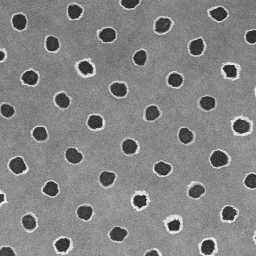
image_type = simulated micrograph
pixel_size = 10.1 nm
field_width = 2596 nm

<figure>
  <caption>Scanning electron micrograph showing a regular array of holes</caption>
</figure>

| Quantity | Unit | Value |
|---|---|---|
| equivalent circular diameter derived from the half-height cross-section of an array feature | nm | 155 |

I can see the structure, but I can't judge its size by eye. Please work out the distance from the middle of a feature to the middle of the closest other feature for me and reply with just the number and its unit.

0.399 micrometres